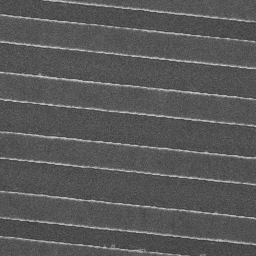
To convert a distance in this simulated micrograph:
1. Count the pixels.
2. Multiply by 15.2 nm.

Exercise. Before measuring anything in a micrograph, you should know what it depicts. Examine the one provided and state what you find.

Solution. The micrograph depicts lines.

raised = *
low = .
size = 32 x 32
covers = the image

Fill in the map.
...........*********************
...................*************
******.......................***
***************.................
*************************.......
..******************************
............********************
.....................***********
...............................*
****............................
**************..................
************************........
********************************
...........*********************
...................*************
.............................***
................................
***********.....................
*******************.............
******************************..
.......*************************
.................***************
..........................******
................................
******..........................
****************................
*************************.......
..******************************
.............*******************
.....................***********
*********......................*
******************..............